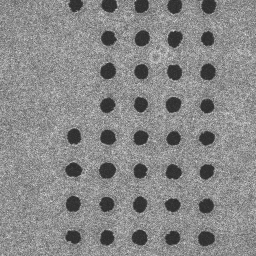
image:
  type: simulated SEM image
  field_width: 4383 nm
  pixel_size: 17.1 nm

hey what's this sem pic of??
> a regular array of holes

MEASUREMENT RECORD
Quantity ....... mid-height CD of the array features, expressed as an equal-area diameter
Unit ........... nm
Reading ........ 262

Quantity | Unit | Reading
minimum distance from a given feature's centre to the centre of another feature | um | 0.561